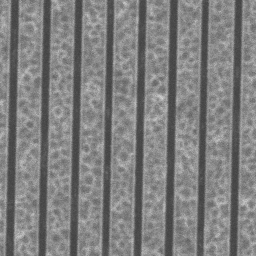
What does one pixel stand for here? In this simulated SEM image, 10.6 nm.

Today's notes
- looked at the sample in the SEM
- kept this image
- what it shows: parallel lines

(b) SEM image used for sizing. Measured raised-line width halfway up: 245 nanometres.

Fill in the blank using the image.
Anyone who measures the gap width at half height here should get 0.0927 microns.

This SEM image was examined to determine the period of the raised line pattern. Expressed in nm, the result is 336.